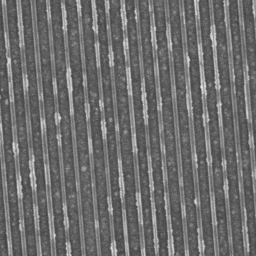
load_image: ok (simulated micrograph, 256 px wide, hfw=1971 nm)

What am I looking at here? parallel lines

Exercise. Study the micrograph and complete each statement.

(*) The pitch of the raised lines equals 113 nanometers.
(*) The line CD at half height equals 31.6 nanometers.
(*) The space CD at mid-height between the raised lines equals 82.5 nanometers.